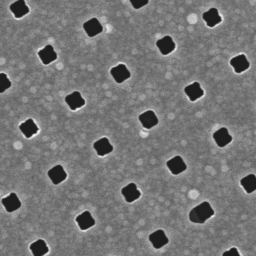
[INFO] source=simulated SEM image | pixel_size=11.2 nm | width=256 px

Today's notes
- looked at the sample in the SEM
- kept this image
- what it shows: a regular array of holes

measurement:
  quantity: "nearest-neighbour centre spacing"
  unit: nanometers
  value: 598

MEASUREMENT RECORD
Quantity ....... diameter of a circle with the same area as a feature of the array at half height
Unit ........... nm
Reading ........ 203